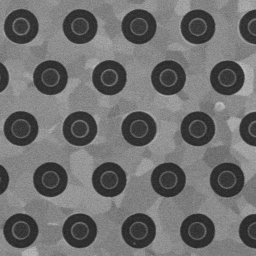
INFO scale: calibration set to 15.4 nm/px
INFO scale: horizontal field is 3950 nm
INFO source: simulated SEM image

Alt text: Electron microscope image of an array of small figures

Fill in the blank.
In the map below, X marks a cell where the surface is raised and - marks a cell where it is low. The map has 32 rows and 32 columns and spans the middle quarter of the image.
XXXXXXXX-------XXXXXXXX------XXX
-XXXXXX----X---XXXXXXX--------XX
-XXXXXX---XXX---XXXXXX--XXXX--XX
-XXXXXX--XXXX---XXXXXX--XXXX---X
-XXXXXX---XXX---XXXXXX--XXXX--XX
-XXXXXX--------XXXXXXX----X---XX
XXXXXXXX------XXXXXXXXX------XXX
XXXXXXXXXX---XXXXXXXXXXX----XXXX
XXXXXXXXXXXXXXXXXXXXXXXXXXXXXXXX
XXXXXXXXXXXXXXXXXXXXXXXXXXXXXXXX
XXXXXXXXXXXXXXXXXXXXXXXXXXXXXXXX
XXXXXXXXXXXXXXXXXXXXXXXXXXXXXXXX
X-----XXXXXXXXXX-----XXXXXXXXXX-
-------XXXXXXXX--------XXXXXXX--
---XX---XXXXXX---XXX---XXXXXX---
--XXXX--XXXXXX---XXXX--XXXXXX--X
--XXXX---XXXXX---XXXX---XXXXX--X
--XXXX--XXXXXX---XXX---XXXXXX---
--------XXXXXXX--------XXXXXXX--
X------XXXXXXXXX------XXXXXXXX--
XXX--XXXXXXXXXXXX---XXXXXXXXXXXX
XXXXXXXXXXXXXXXXXXXXXXXXXXXXXXXX
XXXXXXXXXXXXXXXXXXXXXXXXXXXXXXXX
XXXXXXXXXXXXXXXXXXXXXXXXXXXXXXXX
XXXXXXXXXXX-XXXXXXXXXXXXX--XXXXX
XXXXXXXXX-----XXXXXXXXX------XXX
XXXXXXXX-------XXXXXXX--------XX
-XXXXXX---XXX--XXXXXXX---XXX--XX
-XXXXXX--XXXX---XXXXX---XXXX---X
-XXXXXX--XXXX---XXXXXX--XXXX---X
-XXXXXX---XXX--XXXXXXX---XX---XX
XXXXXXXX-------XXXXXXX--------XX